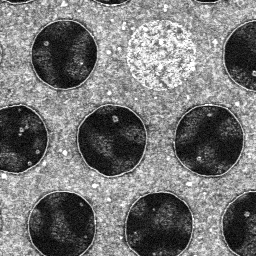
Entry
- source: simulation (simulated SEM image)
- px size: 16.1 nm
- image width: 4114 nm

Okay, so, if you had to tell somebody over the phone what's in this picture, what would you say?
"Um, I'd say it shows raised bodies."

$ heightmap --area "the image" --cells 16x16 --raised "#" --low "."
................
...##..........#
..####........##
..####........##
..####........##
...............#
................
###..####..####.
###..####..####.
###..####..####.
##....##....##..
................
...##....##....#
..####..####..##
..####..####..##
..###...####..##